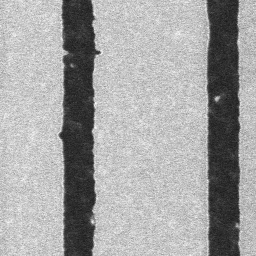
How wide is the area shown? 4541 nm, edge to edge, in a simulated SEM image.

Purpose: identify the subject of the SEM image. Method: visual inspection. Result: one or a few lines or trenches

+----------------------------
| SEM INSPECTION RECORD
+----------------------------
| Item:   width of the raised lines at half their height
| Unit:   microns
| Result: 0.568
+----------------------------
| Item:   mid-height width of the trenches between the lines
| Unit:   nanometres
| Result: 1990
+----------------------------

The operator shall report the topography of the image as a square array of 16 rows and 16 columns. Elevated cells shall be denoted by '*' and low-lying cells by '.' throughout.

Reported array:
....**.......**.
....**.......**.
....**.......**.
....**.......**.
....**.......**.
....**.......**.
....**.......**.
....**.......**.
....**.......**.
....**.......**.
....**.......**.
....**.......**.
....**.......**.
....**.......**.
....**.......**.
....**.......**.